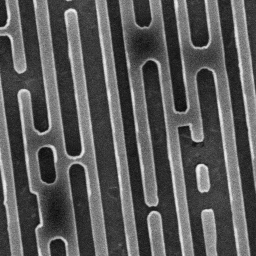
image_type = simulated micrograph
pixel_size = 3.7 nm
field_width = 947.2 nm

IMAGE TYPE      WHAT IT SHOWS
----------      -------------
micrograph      parallel lines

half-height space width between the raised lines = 58.7 nanometers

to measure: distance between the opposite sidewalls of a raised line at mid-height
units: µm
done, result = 0.0463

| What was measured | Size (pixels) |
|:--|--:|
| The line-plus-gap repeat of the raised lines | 28.1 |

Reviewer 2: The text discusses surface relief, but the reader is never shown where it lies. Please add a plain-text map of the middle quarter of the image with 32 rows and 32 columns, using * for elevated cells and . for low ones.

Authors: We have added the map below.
..***.....***...****...***....**
..***.....***...***.....**....**
..***.....***...***.....**....**
..***.....***...****....***...**
..***......**...****....***...**
..***......**....***....***...**
...***.....**....***....***...**
...***.....***...***....***...**
...***.....***...***.....**....*
...***.....***...***.....**....*
...***.....***...***.....**....*
...***.....***...****....***...*
....**......**...****....*******
....**......**....***....*******
....***.....**....***....*******
....***.....***...***....****..*
....***.....***...***.....**....
....***.....***...***.....***...
....***.....***...****....***...
....***.....***...****....***...
.....**......**....***....***...
.....***.....**....***....***...
*...****.....**....***....***...
********.....***...***....***...
********.....***...***....***...
**...***.....***...***.....***..
*....***.....***...****....***..
*....***......**...****....***..
*.....**......**....***....***..
*.....***.....**....***....***..
*.....***.....**....***....***..
**....***.....***...***.....**..